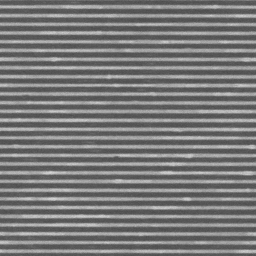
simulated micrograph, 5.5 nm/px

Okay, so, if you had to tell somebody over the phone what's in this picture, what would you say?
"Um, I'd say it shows parallel lines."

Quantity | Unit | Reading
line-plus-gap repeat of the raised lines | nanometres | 48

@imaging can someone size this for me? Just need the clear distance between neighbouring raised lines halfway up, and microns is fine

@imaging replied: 0.0316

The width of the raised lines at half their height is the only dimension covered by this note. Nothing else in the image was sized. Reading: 0.0137 microns